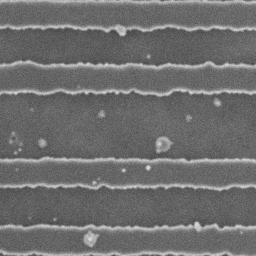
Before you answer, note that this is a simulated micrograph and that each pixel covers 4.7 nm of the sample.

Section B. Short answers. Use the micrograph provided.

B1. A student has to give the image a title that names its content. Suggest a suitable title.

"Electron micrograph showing lines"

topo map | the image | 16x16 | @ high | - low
@@@@@@@@@@@@@@@@
@@@@@@@@@@@@@@@@
----------------
----------------
@@@@@@@@@@@@@@@@
@@@@@@@@@@@@@@@@
----------------
----------------
----------------
----------------
@@@@@@@@@@@@@@@@
@@@@@@@@@@@@@@@@
----------------
----------------
@@@@@@@@@@@@@@@@
@@@@@@@@@@@@@@@@